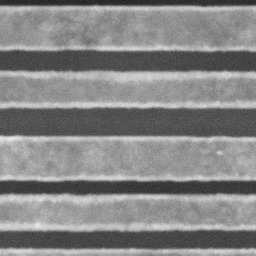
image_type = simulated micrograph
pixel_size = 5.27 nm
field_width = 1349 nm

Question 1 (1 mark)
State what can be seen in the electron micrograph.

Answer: lines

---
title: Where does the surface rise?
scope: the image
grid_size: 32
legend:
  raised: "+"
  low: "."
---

................................
++++++++++++++++++++++++++++++++
++++++++++++++++++++++++++++++++
++++++++++++++++++++++++++++++++
++++++++++++++++++++++++++++++++
++++++++++++++++++++++++++++++++
................................
................................
................................
++++++++++++++++++++++++++++++++
++++++++++++++++++++++++++++++++
++++++++++++++++++++++++++++++++
++++++++++++++++++++++++++++++++
................................
................................
................................
................................
++++++++++++++++++++++++++++++++
++++++++++++++++++++++++++++++++
++++++++++++++++++++++++++++++++
++++++++++++++++++++++++++++++++
++++++++++++++++++++++++++++++++
....++++.........++..+++........
................................
+++.+++++....+++++++++++..++++.+
++++++++++++++++++++++++++++++++
++++++++++++++++++++++++++++++++
++++++++++++++++++++++++++++++++
++++++++++++++++++++++++++++++++
................................
................................
++++++++++++++++++++++++++++++++